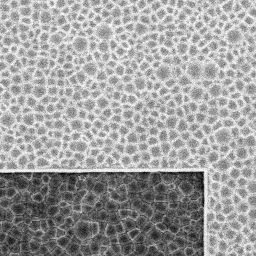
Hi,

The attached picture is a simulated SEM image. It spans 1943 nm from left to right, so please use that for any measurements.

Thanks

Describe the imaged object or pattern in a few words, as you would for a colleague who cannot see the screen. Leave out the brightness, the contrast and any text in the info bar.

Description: one or a few lines or trenches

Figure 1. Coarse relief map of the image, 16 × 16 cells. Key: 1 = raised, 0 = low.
1111111111111111
1111111111111111
1111111111111111
1111111111111111
1111111111111111
1111111111111111
1111111111111111
1111111111111111
1111111111111111
1111111111111111
1111111111111111
0000000000000111
0000000000000111
0000000000000111
0000000000000111
0000000000000111